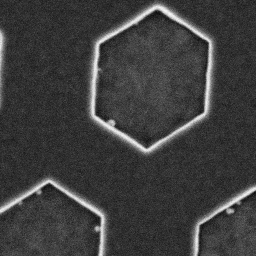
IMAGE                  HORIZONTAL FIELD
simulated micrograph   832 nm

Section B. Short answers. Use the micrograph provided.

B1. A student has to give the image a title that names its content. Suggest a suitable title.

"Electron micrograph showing holes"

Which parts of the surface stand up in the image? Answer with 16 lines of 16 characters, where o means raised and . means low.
oooooooooooooooo
oooooooo...ooooo
ooooooo......ooo
oooooo.......ooo
oooooo.......ooo
oooooo.......ooo
oooooo.......ooo
oooooo......oooo
oooooooo...ooooo
oooooooooooooooo
oooooooooooooooo
oooooooooooooooo
o....oooooooooo.
......ooooooo...
......oooooo....
......oooooo....